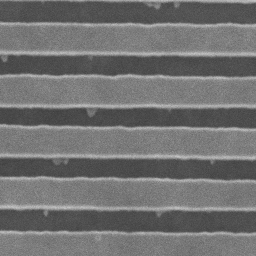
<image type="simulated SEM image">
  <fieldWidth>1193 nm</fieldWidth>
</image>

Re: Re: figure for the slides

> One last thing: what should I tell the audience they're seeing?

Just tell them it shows lines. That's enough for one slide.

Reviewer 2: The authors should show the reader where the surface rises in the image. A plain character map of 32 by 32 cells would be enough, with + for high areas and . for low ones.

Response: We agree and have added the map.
................................
................................
................................
++++++++++++++++++++++++++++++++
++++++++++++++++++++++++++++++++
++++++++++++++++++++++++++++++++
++++++++++++++++++++++++++++++++
................................
................................
++++++..+++++.+++..+............
++++++++++++++++++++++++++++++++
++++++++++++++++++++++++++++++++
++++++++++++++++++++++++++++++++
................................
................................
................................
++++++++++++++++++++++++++++++++
++++++++++++++++++++++++++++++++
++++++++++++++++++++++++++++++++
++++++++++++++++++++++++++++++++
................................
................................
++++++++++++++++++++++.++++.....
++++++++++++++++++++++++++++++++
++++++++++++++++++++++++++++++++
++++++++++++++++++++++++++++++++
................................
................................
................................
++++++++++++++++++++++++++++++++
++++++++++++++++++++++++++++++++
++++++++++++++++++++++++++++++++